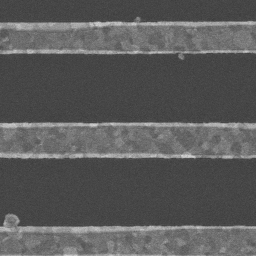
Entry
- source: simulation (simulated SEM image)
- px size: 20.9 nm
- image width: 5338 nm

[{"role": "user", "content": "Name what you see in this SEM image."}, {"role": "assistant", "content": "lines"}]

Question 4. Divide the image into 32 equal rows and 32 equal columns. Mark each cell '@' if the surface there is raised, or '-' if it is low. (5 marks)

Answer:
--------------------------------
--------------------------------
--------------------------------
@@@@@@@@@@@@@@@@@@@@@@@@@@@@@@@@
@@@@@@@@@@@@@@@@@@@@@@@@@@@@@@@@
@@@@@@@@@@@@@@@@@@@@@@@@@@@@@@@@
@@------@-@@@@@@@@@@@@@@@@------
--------------------------------
--------------------------------
--------------------------------
--------------------------------
--------------------------------
--------------------------------
--------------------------------
--------------------------------
--------------------------------
@@@@@@@@@@@@@@@@@@@@@@@@@@@@@@@@
@@@@@@@@@@@@@@@@@@@@@@@@@@@@@@@@
@@@@@@@@@@@@@@@@@@@@@@@@@@@@@@@@
--@@@@@@@@----------@@@@@@@@@@@@
--------------------------------
--------------------------------
--------------------------------
--------------------------------
--------------------------------
--------------------------------
--------------------------------
--------------------------------
-----------------------------@--
@@@@@@@@@@@@@@@@@@@@@@@@@@@@@@@@
@@@@@@@@@@@@@@@@@@@@@@@@@@@@@@@@
@@@@@@@@@@@@@@@@@@@@@@@@@@@@@@@@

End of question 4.